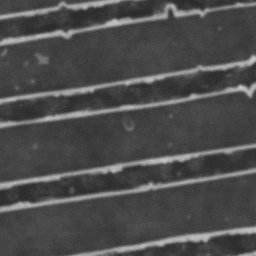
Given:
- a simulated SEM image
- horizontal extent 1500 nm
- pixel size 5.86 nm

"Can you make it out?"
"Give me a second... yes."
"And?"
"one or a few lines or trenches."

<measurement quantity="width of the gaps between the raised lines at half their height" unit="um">0.326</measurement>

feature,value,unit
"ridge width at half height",0.157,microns